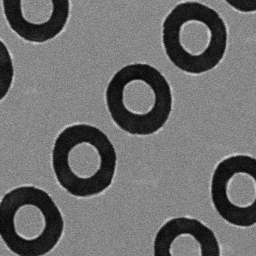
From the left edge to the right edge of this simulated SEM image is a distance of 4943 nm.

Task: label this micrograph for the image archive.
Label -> ring-shaped grooves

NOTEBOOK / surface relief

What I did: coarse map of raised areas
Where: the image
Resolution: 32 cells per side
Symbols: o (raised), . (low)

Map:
...oooo..ooooooooooooo...oooo...
o..ooo...oooooooooooo......ooooo
o..ooo..ooooooooooooo.......oooo
o.......oooooooooooo...ooo..oooo
ooo....ooooooooooooo..oooo..oooo
.ooooooooooooooooooo...ooo..oooo
.oooooooooooooooooooo...o...oooo
.oooooooooooooooooooo.......oooo
..ooooooooooooo....ooo.....ooooo
..oooooooooooo......oooooooooooo
.ooooooooooooo..oo...ooooooooooo
.oooooooooooo..oooo..ooooooooooo
ooooooooooooo..oooo..ooooooooooo
ooooooooooooo...ooo..ooooooooooo
oooooooooooooo.......ooooooooooo
oooooooooo.oooo.....oooooooooooo
oooooooo.....ooo...ooooooooooooo
ooooooo.......oooooooooooooooooo
ooooooo..ooo..oooooooooooooooooo
ooooooo..ooo...oooooooooooooo..o
ooooooo..ooo..ooooooooooooo.....
ooooooo..ooo..ooooooooooooo.....
ooooooo.......oooooooooooo...ooo
oo...ooo.....ooooooooooooo..oooo
o.....ooo...oooooooooooooo..oooo
.......oooooooooooooooooooo..oo.
..ooo..oooooooooooooooooooo.....
..oooo..ooooooooooooo....ooo....
..ooo...oooooooooooo......oooooo
..ooo...ooooooooooo...oo...ooooo
o......oooooooooooo..oooo..ooooo
oo....ooooooooooooo..oooo..ooooo